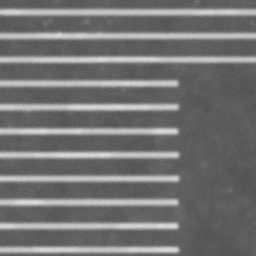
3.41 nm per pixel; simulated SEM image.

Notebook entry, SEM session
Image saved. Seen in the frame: parallel lines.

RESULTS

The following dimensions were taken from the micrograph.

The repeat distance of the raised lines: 80.6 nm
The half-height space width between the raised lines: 0.0651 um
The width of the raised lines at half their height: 16.2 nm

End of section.